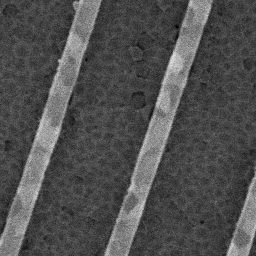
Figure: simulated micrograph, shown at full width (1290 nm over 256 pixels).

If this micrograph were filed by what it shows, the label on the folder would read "one or a few lines or trenches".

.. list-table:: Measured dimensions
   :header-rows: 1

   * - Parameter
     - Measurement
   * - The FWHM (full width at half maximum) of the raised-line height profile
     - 99.3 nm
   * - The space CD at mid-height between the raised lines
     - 430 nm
